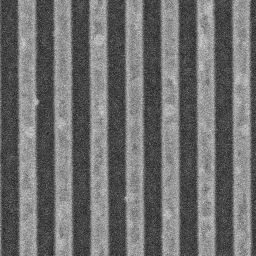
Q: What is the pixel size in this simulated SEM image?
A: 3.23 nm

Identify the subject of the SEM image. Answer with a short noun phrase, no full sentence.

parallel lines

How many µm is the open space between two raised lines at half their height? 0.0641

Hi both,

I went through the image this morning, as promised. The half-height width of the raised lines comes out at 52.4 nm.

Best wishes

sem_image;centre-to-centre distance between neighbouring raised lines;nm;115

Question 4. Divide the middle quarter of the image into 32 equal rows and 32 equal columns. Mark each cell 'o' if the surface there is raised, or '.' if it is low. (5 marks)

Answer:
oo.....oooo.....oooo.....ooo....
oo.....oooo.....oooo.....ooo....
oo.....oooo.....oooo.....ooo....
oo.....oooo.....oooo.....ooo....
oo.....oooo.....oooo.....ooo....
oo.....oooo.....oooo.....ooo....
oo.....oooo.....oooo.....ooo....
oo.....oooo.....oooo.....ooo....
oo.....oooo.....oooo.....ooo....
oo.....oooo.....oooo.....ooo....
oo.....oooo.....oooo.....ooo....
oo.....oooo.....oooo.....ooo....
oo.....oooo.....oooo.....ooo....
oo.....oooo.....oooo.....ooo....
oo.....oooo.....oooo.....ooo....
oo.....oooo.....oooo.....ooo....
oo.....oooo.....oooo.....ooo....
oo.....oooo.....oooo.....ooo....
oo.....oooo.....oooo.....ooo....
oo.....oooo.....oooo.....ooo....
oo.....oooo.....oooo.....ooo....
oo.....oooo.....oooo.....ooo....
oo.....oooo.....oooo.....ooo....
oo.....oooo.....oooo.....ooo....
oo.....oooo.....oooo.....ooo....
oo.....oooo.....oooo.....ooo....
oo.....oooo.....oooo.....ooo....
oo.....oooo.....oooo.....ooo....
oo.....oooo.....oooo.....ooo....
oo.....oooo.....ooo......ooo....
oo.....oooo.....ooo......ooo....
oo.....oooo.....ooo......ooo....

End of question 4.